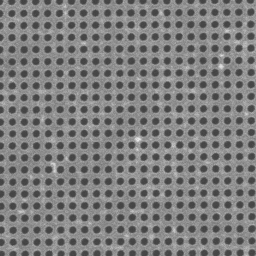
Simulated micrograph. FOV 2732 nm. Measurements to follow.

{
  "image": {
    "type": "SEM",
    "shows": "a regular array of holes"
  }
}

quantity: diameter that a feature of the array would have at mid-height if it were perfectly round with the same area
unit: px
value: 7.9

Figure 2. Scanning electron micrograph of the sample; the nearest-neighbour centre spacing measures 124 nanometers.